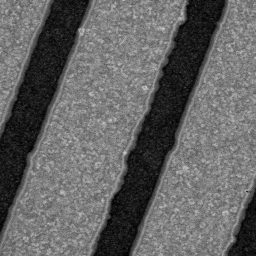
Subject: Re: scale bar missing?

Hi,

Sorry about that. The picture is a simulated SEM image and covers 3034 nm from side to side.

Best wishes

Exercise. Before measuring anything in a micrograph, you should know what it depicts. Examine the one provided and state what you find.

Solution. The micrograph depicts one or a few lines or trenches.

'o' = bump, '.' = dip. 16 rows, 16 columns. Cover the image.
ooo...oooooo..oo
ooo..oooooo...oo
oo...oooooo..ooo
oo..oooooo...ooo
o...oooooo...ooo
o...oooooo..oooo
o..oooooo...oooo
...oooooo..ooooo
...ooooo...ooooo
..oooooo...ooooo
..oooooo..oooooo
.oooooo...oooooo
.oooooo...ooooo.
.oooooo..oooooo.
oooooo...oooooo.
oooooo..oooooo..